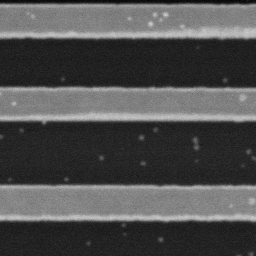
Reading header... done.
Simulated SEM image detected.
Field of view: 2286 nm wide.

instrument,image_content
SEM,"lines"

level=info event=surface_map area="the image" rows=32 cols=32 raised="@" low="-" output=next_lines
--------------------------------
@@@@@@@@@@@@@@@@@@@@@@@@@@@@@@@@
@@@@@@@@@@@@@@@@@@@@@@@@@@@@@@@@
@@@@@@@@@@@@@@@@@@@@@@@@@@@@@@@@
@@@@@@@@@@@@@@@@@@@@@@@@@@@@@@@@
--------------------------------
--------------------------------
--------------------------------
--------------------------------
--------------------------------
--------------------------------
@@@@@@@@@@@@@@@@@@@@@@@@@@@@@@@@
@@@@@@@@@@@@@@@@@@@@@@@@@@@@@@@@
@@@@@@@@@@@@@@@@@@@@@@@@@@@@@@@@
@@@@@@@@@@@@@@@@@@@@@@@@@@@@@@@@
--------------------------------
--------------------------------
--------------------------------
--------------------------------
--------------------------------
--------------------------------
--------------------------------
--------------------------------
@@@@@@@@@@@@@@@@@@@@@@@@@@@@@@@@
@@@@@@@@@@@@@@@@@@@@@@@@@@@@@@@@
@@@@@@@@@@@@@@@@@@@@@@@@@@@@@@@@
@@@@@@@@@@@@@@@@@@@@@@@@@@@@@@@@
@@@@@@-@@@-@@@-@@@@@@@@@@@@@@-@@
--------------------------------
--------------------------------
--------------------------------
--------------------------------